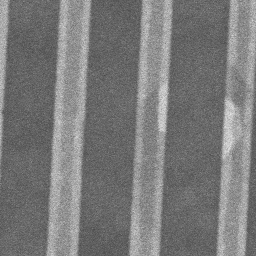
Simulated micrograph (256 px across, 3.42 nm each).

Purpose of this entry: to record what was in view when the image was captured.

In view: one or a few lines or trenches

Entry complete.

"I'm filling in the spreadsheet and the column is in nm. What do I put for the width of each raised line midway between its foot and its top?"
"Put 81.1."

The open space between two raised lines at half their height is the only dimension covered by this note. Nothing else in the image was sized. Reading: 199 nanometres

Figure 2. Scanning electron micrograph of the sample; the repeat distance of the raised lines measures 0.288 microns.